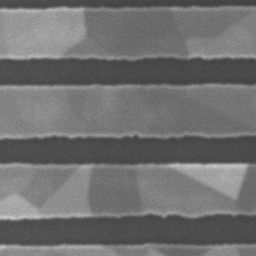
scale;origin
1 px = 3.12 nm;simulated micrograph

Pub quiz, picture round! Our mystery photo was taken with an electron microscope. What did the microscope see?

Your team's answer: lines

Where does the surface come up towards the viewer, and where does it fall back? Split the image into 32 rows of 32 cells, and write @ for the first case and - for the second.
--------------------------------
@@@@@@@@@@@@@@@@@@@@@@@@@@@@@@@@
@@@@@@@@@@@@@@@@@@@@@@@@@@@@@@@@
@@@@@@@@@@@@@@@@@@@@@@@@@@@@@@@@
@@@@@@@@@@@@@@@@@@@@@@@@@@@@@@@@
@@@@@@@@@@@@@@@@@@@@@@@@@@@@@@@@
@@@@@@@@@@@@@@@@@@@@@@@@@@@@@@@@
--------------------------------
--------------------------------
--------------------------------
--------------------------------
@@@@@@@@@@@@@@@@@@@@@@@@@@@@@@@@
@@@@@@@@@@@@@@@@@@@@@@@@@@@@@@@@
@@@@@@@@@@@@@@@@@@@@@@@@@@@@@@@@
@@@@@@@@@@@@@@@@@@@@@@@@@@@@@@@@
@@@@@@@@@@@@@@@@@@@@@@@@@@@@@@@@
@@@@@@@@@@@@@@@@@@@@@@@@@@@@@@@@
--------------------------------
--------------------------------
--------------------------------
-@@-------------------@---------
@@@@@@@@@@@@@@@@@@@@@@@@@@@@@@@@
@@@@@@@@@@@@@@@@@@@@@@@@@@@@@@@@
@@@@@@@@@@@@@@@@@@@@@@@@@@@@@@@@
@@@@@@@@@@@@@@@@@@@@@@@@@@@@@@@@
@@@@@@@@@@@@@@@@@@@@@@@@@@@@@@@@
@@@@@@@@@@@@@@@@@@@@@@@@@@@@@@@@
--------------------------------
--------------------------------
--------------------------------
------------------@@------------
@@@@@@@@@@@@@@@@@@@@@@@@@@@@@@@@